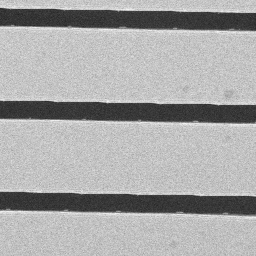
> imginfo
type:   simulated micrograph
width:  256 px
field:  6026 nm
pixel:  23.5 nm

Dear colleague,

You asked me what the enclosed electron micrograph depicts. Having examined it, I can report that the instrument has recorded lines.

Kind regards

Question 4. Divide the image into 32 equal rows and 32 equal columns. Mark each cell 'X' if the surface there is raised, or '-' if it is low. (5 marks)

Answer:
XXXXXXXXXXXXXXXXXXXXXXXXXXXXXXXX
--------------------------XXXXXX
--------------------------------
XXXXXXXX------------------------
XXXXXXXXXXXXXXXXXXXXXXXXXXXXXXXX
XXXXXXXXXXXXXXXXXXXXXXXXXXXXXXXX
XXXXXXXXXXXXXXXXXXXXXXXXXXXXXXXX
XXXXXXXXXXXXXXXXXXXXXXXXXXXXXXXX
XXXXXXXXXXXXXXXXXXXXXXXXXXXXXXXX
XXXXXXXXXXXXXXXXXXXXXXXXXXXXXXXX
XXXXXXXXXXXXXXXXXXXXXXXXXXXXXXXX
XXXXXXXXXXXXXXXXXXXXXXXXXXXXXXXX
XXXXXXXXXXXXXXXXXXXXXXXXXXXXXXXX
--------------------------------
--------------------------------
XXXXXXXXXXXXXXXXXXXXXXXXXXXX----
XXXXXXXXXXXXXXXXXXXXXXXXXXXXXXXX
XXXXXXXXXXXXXXXXXXXXXXXXXXXXXXXX
XXXXXXXXXXXXXXXXXXXXXXXXXXXXXXXX
XXXXXXXXXXXXXXXXXXXXXXXXXXXXXXXX
XXXXXXXXXXXXXXXXXXXXXXXXXXXXXXXX
XXXXXXXXXXXXXXXXXXXXXXXXXXXXXXXX
XXXXXXXXXXXXXXXXXXXXXXXXXXXXXXXX
XXXXXXXXXXXXXXXXXXXXXXXXXXXXXXXX
-------------------------------X
--------------------------------
XXXXXXX-------------------------
XXXXXXXXXXXXXXXXXXXXXXXXXXXXXXXX
XXXXXXXXXXXXXXXXXXXXXXXXXXXXXXXX
XXXXXXXXXXXXXXXXXXXXXXXXXXXXXXXX
XXXXXXXXXXXXXXXXXXXXXXXXXXXXXXXX
XXXXXXXXXXXXXXXXXXXXXXXXXXXXXXXX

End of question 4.